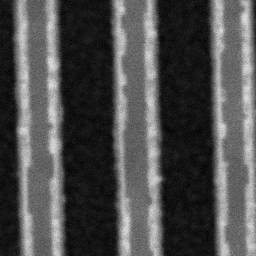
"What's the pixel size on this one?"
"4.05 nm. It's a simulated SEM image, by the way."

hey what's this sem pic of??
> one or a few lines or trenches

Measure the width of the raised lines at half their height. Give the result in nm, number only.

129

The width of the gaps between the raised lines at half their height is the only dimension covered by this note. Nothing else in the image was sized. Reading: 264 nm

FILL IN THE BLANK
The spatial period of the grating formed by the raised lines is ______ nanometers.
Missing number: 395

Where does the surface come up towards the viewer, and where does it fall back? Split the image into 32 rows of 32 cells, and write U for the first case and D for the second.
DDDUUUUDDDDDDDDUUUUDDDDDDDDUUUUD
DDDUUUUDDDDDDDDUUUUDDDDDDDDUUUUD
DDDUUUUDDDDDDDDUUUUDDDDDDDDUUUUD
DDDUUUUDDDDDDDDUUUUDDDDDDDDUUUUD
DDDUUUUDDDDDDDDUUUUDDDDDDDDUUUUD
DDDUUUUDDDDDDDDUUUUDDDDDDDDUUUUD
DDDUUUUDDDDDDDDUUUUDDDDDDDDUUUUD
DDDUUUUDDDDDDDDUUUUDDDDDDDDUUUUD
DDDUUUUDDDDDDDDUUUUDDDDDDDDUUUUD
DDDUUUUDDDDDDDDUUUUDDDDDDDDUUUUD
DDDUUUUDDDDDDDDUUUUDDDDDDDDUUUUD
DDDUUUUDDDDDDDDUUUUDDDDDDDDUUUUD
DDDUUUUDDDDDDDDUUUUDDDDDDDDUUUUD
DDDUUUUDDDDDDDDUUUUDDDDDDDDUUUUD
DDDUUUUDDDDDDDDUUUUDDDDDDDDDUUUD
DDDUUUUDDDDDDDDUUUUDDDDDDDDUUUUU
DDUUUUUDDDDDDDDUUUUDDDDDDDDUUUUU
DDDUUUUDDDDDDDDUUUUDDDDDDDDDUUUD
DDDUUUUUDDDDDDDUUUUDDDDDDDDDUUUD
DDDUUUUDDDDDDDDUUUUUDDDDDDDDUUUD
DDDUUUUDDDDDDDDUUUUDDDDDDDDDUUUD
DDDUUUUDDDDDDDDUUUUDDDDDDDDUUUUD
DDDUUUUDDDDDDDDUUUUUDDDDDDDUUUUD
DDDUUUUDDDDDDDDUUUUDDDDDDDDUUUUD
DDDUUUUDDDDDDDDUUUUDDDDDDDDUUUUU
DDDUUUUDDDDDDDDUUUUDDDDDDDDDUUUU
DDDUUUUDDDDDDDDUUUUUDDDDDDDDUUUU
DDDUUUUDDDDDDDDUUUUDDDDDDDDDUUUU
DDDUUUUDDDDDDDDUUUUDDDDDDDDDUUUD
DDDUUUUDDDDDDDDUUUUDDDDDDDDDUUUU
DDDUUUUDDDDDDDDUUUUUDDDDDDDDUUUU
DDDUUUUDDDDDDDDUUUUUDDDDDDDDUUUU